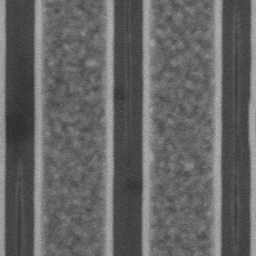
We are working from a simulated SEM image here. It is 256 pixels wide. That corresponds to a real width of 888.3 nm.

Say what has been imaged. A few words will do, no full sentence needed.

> wiring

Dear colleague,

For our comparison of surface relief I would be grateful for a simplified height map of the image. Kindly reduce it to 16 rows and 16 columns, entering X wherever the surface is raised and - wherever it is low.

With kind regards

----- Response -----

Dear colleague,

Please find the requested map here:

--XXXXX--XXXXX--
--XXXXX--XXXXX--
--XXXXX--XXXXX--
--XXXXX--XXXXX--
--XXXXX--XXXXX--
--XXXXX--XXXXX--
--XXXXX--XXXXX--
--XXXXX--XXXXX--
--XXXXX--XXXXX--
--XXXXX--XXXXX--
--XXXXX--XXXXX--
--XXXXX--XXXXX--
--XXXXX--XXXXX--
--XXXXX--XXXXX--
--XXXXX--XXXXX--
--XXXXX--XXXXX--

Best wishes